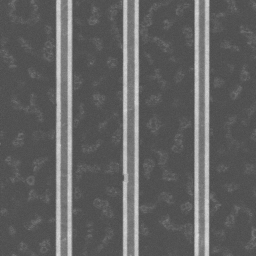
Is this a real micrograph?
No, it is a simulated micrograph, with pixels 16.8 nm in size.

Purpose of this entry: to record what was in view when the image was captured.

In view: one or a few lines or trenches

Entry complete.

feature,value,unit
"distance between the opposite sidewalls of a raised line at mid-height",183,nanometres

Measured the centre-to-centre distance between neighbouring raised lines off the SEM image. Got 1.16 um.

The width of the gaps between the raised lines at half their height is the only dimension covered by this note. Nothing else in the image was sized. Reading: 978 nm